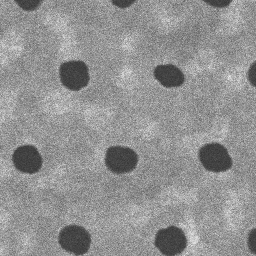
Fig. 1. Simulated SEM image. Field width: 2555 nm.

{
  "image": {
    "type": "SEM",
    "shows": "holes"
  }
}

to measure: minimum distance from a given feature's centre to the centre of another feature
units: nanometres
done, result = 939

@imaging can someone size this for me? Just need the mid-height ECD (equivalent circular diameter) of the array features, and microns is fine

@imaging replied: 0.305